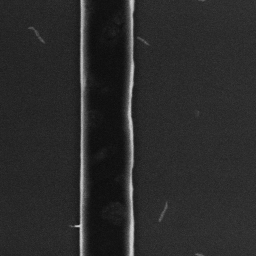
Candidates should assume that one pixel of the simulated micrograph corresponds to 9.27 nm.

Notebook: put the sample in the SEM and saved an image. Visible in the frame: one or a few lines or trenches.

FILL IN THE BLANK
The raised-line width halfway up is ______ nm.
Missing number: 468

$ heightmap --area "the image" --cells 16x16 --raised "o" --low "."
.....ooo........
.....ooo........
.....ooo........
.....ooo........
.....ooo........
.....ooo........
.....ooo........
.....ooo........
.....ooo........
.....ooo........
.....ooo........
.....ooo........
.....ooo........
.....ooo........
.....ooo........
.....ooo........